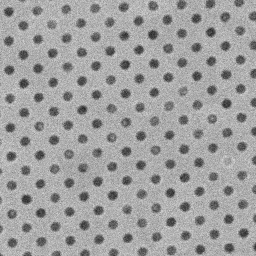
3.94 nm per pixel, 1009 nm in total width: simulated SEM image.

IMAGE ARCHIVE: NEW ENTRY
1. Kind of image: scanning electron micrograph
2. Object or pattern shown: a regular array of holes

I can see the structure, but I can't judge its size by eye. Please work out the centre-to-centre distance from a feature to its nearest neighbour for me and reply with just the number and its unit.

79 nm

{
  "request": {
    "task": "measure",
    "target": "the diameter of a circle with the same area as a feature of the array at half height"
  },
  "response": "0.041 micrometres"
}